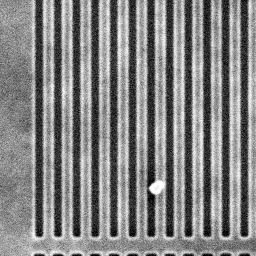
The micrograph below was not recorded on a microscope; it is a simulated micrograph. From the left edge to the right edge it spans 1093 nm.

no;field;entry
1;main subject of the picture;groups of lines, slits or small figures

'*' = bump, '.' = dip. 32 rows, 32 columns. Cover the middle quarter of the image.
**..**...**...**..***..**...**..
**..**...**...**..***..**...**..
**..**...**...**..***..**...**..
**..**...**...**..***..**...**..
**..**...**...**..***..**...**..
**..**...**...**..***..**...**..
**..**...**...**..***..**...**..
**..**...**...**..***..**...**..
**..**...**...**..***..**...**..
**..**...**...**..***..**...**..
**..***..**...**..***..**...**..
**..***..**...**..***..**...**..
**..***..**...**..***..**...**..
**..***..**...**..***..**...**..
**..***..**...**..***..**...**..
**..***..**...**..***..**...**..
**..***..**...**..***..**...**..
**..***..**...**..***..**...**..
**..***..**...**..***..**...**..
**..***..**...**..***..**...**..
**..***..**...**..***..**...**..
**..***..**...**..***..**...**..
**..***..**...**..***..**...**..
**..***..**...**..***..**...**..
**..***..**...**..***..**...**..
**..***..**...**..***..**...**..
**..***..**...**..***..**...**..
**..***..**...**..***..**...**..
**..***..**...**..***..**...**..
**..***..**...**..***..**...**..
**..***..**...**..***.***...**..
**..***..**...**..***.***...**..